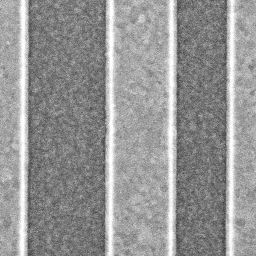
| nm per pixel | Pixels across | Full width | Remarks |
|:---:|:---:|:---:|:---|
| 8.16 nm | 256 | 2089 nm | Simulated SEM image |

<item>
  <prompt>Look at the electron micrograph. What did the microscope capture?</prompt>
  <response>one or a few lines or trenches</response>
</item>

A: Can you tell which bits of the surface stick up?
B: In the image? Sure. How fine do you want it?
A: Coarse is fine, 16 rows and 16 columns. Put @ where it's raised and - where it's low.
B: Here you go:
@------@@@@----@
@------@@@@----@
@------@@@@----@
@------@@@@----@
@------@@@@----@
@------@@@@----@
@------@@@@----@
@------@@@@----@
@------@@@@----@
@------@@@@----@
@------@@@@---@@
@------@@@@---@@
@------@@@@---@@
@------@@@@---@@
@------@@@@---@@
@------@@@@---@@